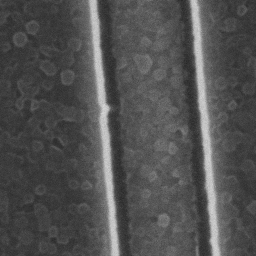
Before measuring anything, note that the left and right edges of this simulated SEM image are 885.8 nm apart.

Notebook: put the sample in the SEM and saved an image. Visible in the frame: one or a few lines or trenches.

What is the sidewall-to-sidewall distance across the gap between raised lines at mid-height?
338 nm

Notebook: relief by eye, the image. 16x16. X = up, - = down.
XXXXXX------XXXX
XXXXXX------XXXX
XXXXXX------XXXX
XXXXXX------XXXX
XXXXXX------XXXX
XXXXXX------XXXX
XXXXXXX------XXX
XXXXXXX------XXX
XXXXXXX------XXX
XXXXXXX------XXX
XXXXXXX------XXX
XXXXXXX------XXX
XXXXXXX------XXX
XXXXXXX------XXX
XXXXXXX------XXX
XXXXXXX------XXX